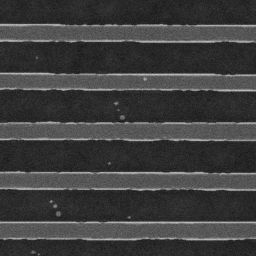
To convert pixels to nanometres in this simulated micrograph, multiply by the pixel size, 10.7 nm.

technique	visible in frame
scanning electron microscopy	lines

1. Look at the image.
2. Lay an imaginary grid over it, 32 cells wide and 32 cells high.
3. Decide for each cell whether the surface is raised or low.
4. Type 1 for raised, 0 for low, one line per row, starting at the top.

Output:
00000000000000000000000000000000
00000000000000000000000000000000
00000000000000000000000000000000
11111111111111111111111111111111
11111111111111111111111111111111
00000000000000000000000000000000
00000000000000000000000000000000
00000000000000000000000000000000
00000000000000000000000000000000
11111111111111111111111111111111
11111111111111111111111111111111
00000000000000000000000000000000
00000000000000000000000000000000
00000000000000000000000000000000
00000000000000000000000000000000
11111111111111111111111111111111
11111111111111111111111111111111
00000000000000000000000000000000
00000000000000000000000000000000
00000000000000000000000000000000
00000000000000000000000000000000
00000000000000000000000000000000
11111111111111111111111111111111
11111111111111111111111111111111
00000000000000000000000000000000
00000000000000000000000000000000
00000000000000000000000000000000
00000000000000000000000000000000
11111111111111111111111111111111
11111111111111111111111111111111
00000000000000000000000000000000
00000000000000000000000000000000